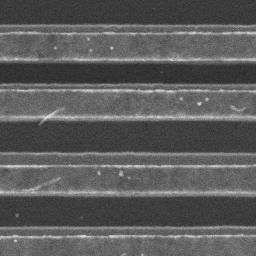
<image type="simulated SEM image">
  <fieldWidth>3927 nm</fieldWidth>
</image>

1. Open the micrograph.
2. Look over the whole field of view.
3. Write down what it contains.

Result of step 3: lines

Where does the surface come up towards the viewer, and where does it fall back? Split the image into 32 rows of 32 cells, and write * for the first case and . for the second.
................................
................................
................................
********************************
********************************
********************************
********************************
********************************
................................
................................
................................
********************************
********************************
********************************
********************************
................................
................................
................................
................................
********************************
********************************
********************************
********************************
********************************
................................
................................
................................
................................
.............*...........*******
********************************
********************************
********************************